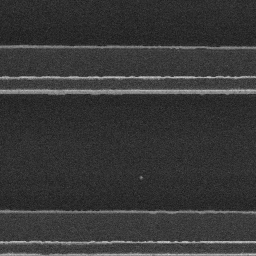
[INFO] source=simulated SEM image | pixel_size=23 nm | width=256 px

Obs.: lines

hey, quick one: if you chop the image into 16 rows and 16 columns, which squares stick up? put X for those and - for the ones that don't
----------------
----------------
----------------
XXXXXXXXXXXXXXXX
XXXXXXXXXXXXXXXX
XXXXXXXXXXXXXXXX
----------------
----------------
----------------
----------------
----------------
----------------
----------------
XXXXXXXXXXXXXXXX
XXXXXXXXXXXXXXXX
XXXXXXXXXXXXXXXX